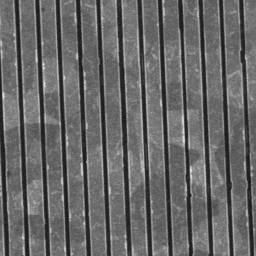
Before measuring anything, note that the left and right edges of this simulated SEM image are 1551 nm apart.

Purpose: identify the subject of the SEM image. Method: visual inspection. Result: parallel lines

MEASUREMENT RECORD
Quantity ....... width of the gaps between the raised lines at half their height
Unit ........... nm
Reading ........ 28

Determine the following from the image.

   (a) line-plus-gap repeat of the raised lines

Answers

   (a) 20.4 pixels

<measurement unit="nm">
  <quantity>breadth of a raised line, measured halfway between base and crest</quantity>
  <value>94.6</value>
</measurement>